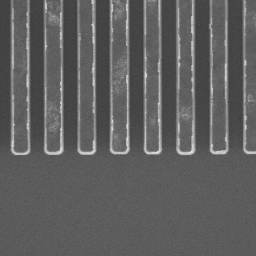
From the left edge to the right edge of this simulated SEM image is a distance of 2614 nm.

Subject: parallel lines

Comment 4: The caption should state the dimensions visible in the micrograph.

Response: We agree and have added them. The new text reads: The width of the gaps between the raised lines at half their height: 15.9 px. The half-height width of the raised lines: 180 nm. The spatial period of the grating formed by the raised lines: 338 nm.